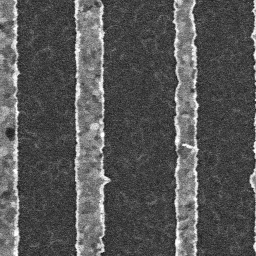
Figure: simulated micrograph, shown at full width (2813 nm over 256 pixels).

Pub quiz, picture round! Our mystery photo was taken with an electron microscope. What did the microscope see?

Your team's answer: one or a few lines or trenches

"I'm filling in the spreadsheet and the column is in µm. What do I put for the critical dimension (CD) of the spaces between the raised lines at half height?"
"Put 0.666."